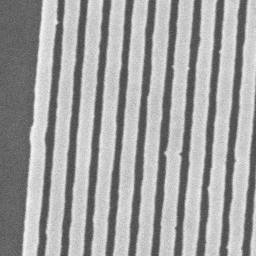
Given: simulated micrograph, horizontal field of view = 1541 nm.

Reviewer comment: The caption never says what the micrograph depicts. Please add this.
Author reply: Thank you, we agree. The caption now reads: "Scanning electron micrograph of parallel lines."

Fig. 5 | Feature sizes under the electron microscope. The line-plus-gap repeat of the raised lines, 136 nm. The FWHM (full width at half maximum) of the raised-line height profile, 0.0847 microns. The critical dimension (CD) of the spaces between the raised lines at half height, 52.5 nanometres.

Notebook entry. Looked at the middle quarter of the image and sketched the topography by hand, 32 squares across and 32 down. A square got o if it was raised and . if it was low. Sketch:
oo...ooo...ooo..oooo..oooo..ooo.
oo...ooo..oooo..oooo..ooo...ooo.
oo...ooo..oooo..ooo...ooo...ooo.
oo...ooo..oooo..ooo...ooo..oooo.
oo...ooo..oooo..ooo...ooo..oooo.
oo..oooo..oooo..ooo...ooo..oooo.
oo..oooo..oooo..ooo...ooo..oooo.
oo..oooo..oooo..ooo..oooo..ooo..
oo..oooo..ooo...ooo..ooo...ooo..
oo..oooo..ooo...ooo..ooo...ooo..
oo..ooo...ooo..oooo..ooo...ooo..
oo..oooo..ooo..oooo..ooo...ooo..
oo..ooo...ooo..oooo..ooo...ooo..
oo..ooo...ooo..oooo..ooo...ooo..
o...ooo..oooo..ooo...ooo...ooo..
o...ooo..oooo..ooo...ooo...ooo..
o...ooo..oooo..ooo...ooo..oooo..
o...ooo..oooo..ooo...ooo..oooo..
o..oooo..oooo..ooo...ooo..oooo..
o..oooo..oooo..ooo..oooo..oooo..
o..oooo..oooo..ooo..oooo..ooo...
o..oooo..oooo..ooo..oooo..ooo...
o..oooo..oooo.oooo..oooo.oooo..o
o..oooo..ooo..oooo..oooo..ooo..o
o..ooo...ooo..oooo..ooo...ooo...
o..ooo...ooo..oooo..ooo...ooo..o
o..ooo...ooo..oooo..ooo...ooo..o
...ooo..oooo..ooo...ooo...ooo..o
...ooo...ooo..ooo...ooo..oooo..o
...ooo..oooo..oooo..ooo..oooo..o
..oooo..oooo..ooo..oooo..oooo..o
..oooo..ooo...ooo..oooo..oooo..o